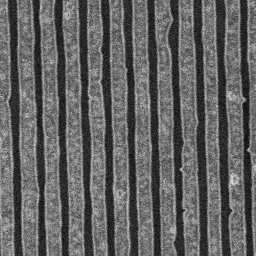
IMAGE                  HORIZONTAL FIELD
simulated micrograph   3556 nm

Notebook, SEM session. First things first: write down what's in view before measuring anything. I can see parallel lines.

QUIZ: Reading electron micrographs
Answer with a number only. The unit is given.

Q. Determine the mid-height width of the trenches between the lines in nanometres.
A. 128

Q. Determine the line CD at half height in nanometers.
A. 194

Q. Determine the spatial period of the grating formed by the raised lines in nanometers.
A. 320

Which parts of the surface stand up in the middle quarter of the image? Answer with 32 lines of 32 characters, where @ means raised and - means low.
-@@@--@@@---@@@--@@@@---@@@--@@@
-@@@--@@@---@@@@--@@@---@@@--@@@
-@@@--@@@---@@@---@@@---@@@--@@@
-@@@--@@@---@@@---@@@---@@@--@@@
-@@@--@@@---@@@@--@@@---@@@--@@@
-@@@--@@@---@@@@--@@@---@@@--@@@
-@@@--@@@---@@@@--@@@---@@@--@@@
@@@@--@@@@--@@@@--@@@---@@@--@@@
-@@@---@@@--@@@@--@@@---@@@--@@@
-@@@--@@@@--@@@@--@@@---@@@--@@@
-@@@--@@@@--@@@@--@@@---@@@--@@@
-@@@--@@@@--@@@@--@@@---@@@--@@@
-@@@--@@@@--@@@---@@@---@@@--@@@
-@@@--@@@@--@@@@--@@@---@@@--@@@
-@@@--@@@@--@@@@--@@@---@@@---@@
-@@@---@@@--@@@@--@@@---@@@---@@
-@@@---@@@--@@@@--@@@---@@@---@@
-@@@---@@@--@@@@--@@@---@@@---@@
-@@@---@@@--@@@@--@@@---@@@---@@
-@@@---@@@---@@@--@@@---@@@---@@
-@@@---@@@---@@@--@@@@--@@@---@@
-@@@---@@@---@@@--@@@@--@@@---@@
-@@@---@@@--@@@@--@@@@--@@@---@@
-@@@---@@@---@@@--@@@@--@@@---@@
-@@@---@@@---@@@--@@@@--@@@---@@
-@@@---@@@---@@@--@@@@--@@@---@@
-@@@---@@@---@@@--@@@---@@@--@@@
-@@@---@@@---@@@--@@@---@@@---@@
-@@@---@@@---@@@--@@@---@@@---@@
-@@@@--@@@---@@@--@@@@--@@@---@@
-@@@@--@@@--@@@@--@@@@--@@@@--@@
-@@@@--@@@--@@@@--@@@@--@@@@--@@